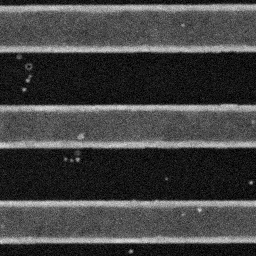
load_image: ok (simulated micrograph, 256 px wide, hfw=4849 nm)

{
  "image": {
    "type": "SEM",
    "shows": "lines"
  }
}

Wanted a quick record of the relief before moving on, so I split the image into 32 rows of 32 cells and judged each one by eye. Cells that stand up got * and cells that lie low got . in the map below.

................................
********************************
********************************
********************************
********************************
********************************
................................
................................
................................
................................
................................
................................
................................
...........**.***...............
********************************
********************************
********************************
********************************
................................
................................
................................
................................
................................
................................
................................
................................
********************************
********************************
********************************
********************************
................................
................................